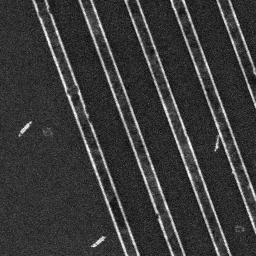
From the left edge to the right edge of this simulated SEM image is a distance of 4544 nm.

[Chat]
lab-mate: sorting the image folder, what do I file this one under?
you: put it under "parallel lines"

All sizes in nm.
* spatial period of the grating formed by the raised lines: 766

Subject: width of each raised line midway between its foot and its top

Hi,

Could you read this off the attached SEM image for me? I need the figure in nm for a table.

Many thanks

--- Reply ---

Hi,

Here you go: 204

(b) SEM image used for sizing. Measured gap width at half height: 563 nm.